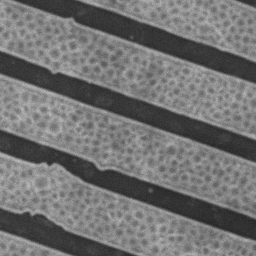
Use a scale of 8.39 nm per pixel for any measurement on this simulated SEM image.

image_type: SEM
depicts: one or a few lines or trenches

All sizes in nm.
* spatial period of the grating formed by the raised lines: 609